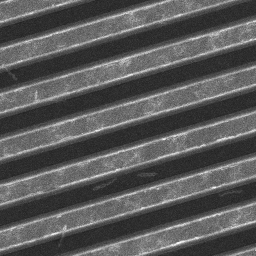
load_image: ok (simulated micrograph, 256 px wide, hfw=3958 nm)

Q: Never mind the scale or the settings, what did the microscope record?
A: parallel lines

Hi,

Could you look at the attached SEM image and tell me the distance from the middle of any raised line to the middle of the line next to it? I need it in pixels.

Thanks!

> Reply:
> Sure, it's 43.8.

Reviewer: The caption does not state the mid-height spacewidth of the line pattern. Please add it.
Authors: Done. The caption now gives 21.6 px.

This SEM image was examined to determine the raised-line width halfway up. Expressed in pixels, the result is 22.5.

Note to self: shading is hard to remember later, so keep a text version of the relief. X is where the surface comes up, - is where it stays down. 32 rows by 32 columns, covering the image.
XXXXXXXXX----------XXXXXXXXX----
XXXXX----------XXXXXXXXXX-------
XX----------XXXXXXXXXX---------X
--------XXXXXXXXXX----------XXXX
-----XXXXXXXXXX---------XXXXXXXX
-XXXXXXXXXX----------XXXXXXXXXX-
XXXXXXXX---------XXXXXXXXXX-----
XXXX----------XXXXXXXXXX--------
X---------XXXXXXXXXXX---------XX
-------XXXXXXXXXX----------XXXXX
---XXXXXXXXXXX---------XXXXXXXXX
XXXXXXXXXX----------XXXXXXXXXX--
XXXXXXX---------XXXXXXXXXX------
XXX----------XXXXXXXXXX---------
---------XXXXXXXXXXX---------XXX
------XXXXXXXXXX----------XXXXXX
---XXXXXXXXXX---------XXXXXXXXXX
XXXXXXXXX----------XXXXXXXXXX---
XXXXXX---------XXXXXXXXXXX------
XX----------XXXXXXXXXX----------
---------XXXXXXXXXX---------XXXX
-----XXXXXXXXXX----------XXXXXXX
--XXXXXXXXXX---------XXXXXXXXXX-
XXXXXXXX----------XXXXXXXXXX----
XXXXX---------XXXXXXXXXX--------
X----------XXXXXXXXXX----------X
-------XXXXXXXXXX----------XXXXX
----XXXXXXXXXX----------XXXXXXXX
XXXXXXXXXX----------XXXXXXXXXX--
XXXXXXX----------XXXXXXXXXX-----
XXXX---------XXXXXXXXXX---------
----------XXXXXXXXXX----------XX